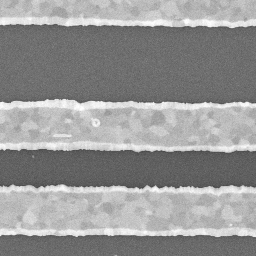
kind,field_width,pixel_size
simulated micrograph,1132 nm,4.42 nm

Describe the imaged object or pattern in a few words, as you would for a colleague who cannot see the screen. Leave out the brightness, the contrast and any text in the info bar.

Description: lines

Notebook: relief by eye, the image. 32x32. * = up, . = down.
********************************
********************************
********************************
................................
................................
................................
................................
................................
................................
................................
................................
................................
................................
********************************
********************************
********************************
********************************
********************************
***.*.***...********************
................................
................................
................................
................................
****.****..*****..**...*....***.
********************************
********************************
********************************
********************************
********************************
................................
................................
................................